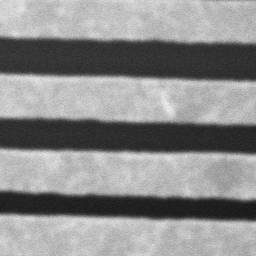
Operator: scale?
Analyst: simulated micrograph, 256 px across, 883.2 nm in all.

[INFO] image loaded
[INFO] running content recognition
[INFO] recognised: lines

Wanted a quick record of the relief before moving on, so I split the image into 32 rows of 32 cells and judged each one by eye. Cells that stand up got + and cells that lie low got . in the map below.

++++++++++++++++++++++++++++++++
++++++++++++++++++++++++++++++++
++++++++++++++++++++++++++++++++
++++++++++++++++++++++++++++++++
++++++++++++++++++++++++++++++++
................................
................................
................................
................................
+++.............................
++++++++++++++++++++++++++++++++
++++++++++++++++++++++++++++++++
++++++++++++++++++++++++++++++++
++++++++++++++++++++++++++++++++
++++++++++++++++++++++++++++++++
................................
................................
................................
................................
++++++++++++++++++++++++++++++++
++++++++++++++++++++++++++++++++
++++++++++++++++++++++++++++++++
++++++++++++++++++++++++++++++++
++++++++++++++++++++++++++++++++
....................+.++++++++++
................................
................................
+++++++++++++++++++++...........
++++++++++++++++++++++++++++++++
++++++++++++++++++++++++++++++++
++++++++++++++++++++++++++++++++
++++++++++++++++++++++++++++++++